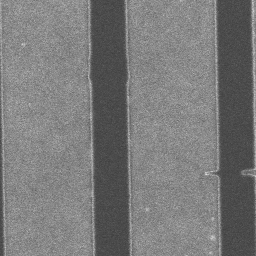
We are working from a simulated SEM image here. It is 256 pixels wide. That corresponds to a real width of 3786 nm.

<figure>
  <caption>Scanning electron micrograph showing one or a few lines or trenches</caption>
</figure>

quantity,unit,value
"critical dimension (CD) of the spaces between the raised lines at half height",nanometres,1290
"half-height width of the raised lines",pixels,38.4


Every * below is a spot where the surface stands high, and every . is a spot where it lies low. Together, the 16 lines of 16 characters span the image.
......**.....***
......**.....***
......**.....***
......**.....***
......**......**
......**......**
......**......**
......**......**
......**......**
......**......**
......**.....***
......**......**
......**......**
......**......**
......**......**
......**......**